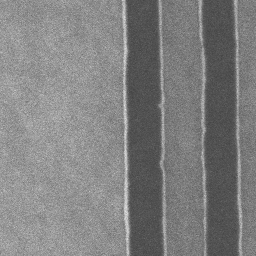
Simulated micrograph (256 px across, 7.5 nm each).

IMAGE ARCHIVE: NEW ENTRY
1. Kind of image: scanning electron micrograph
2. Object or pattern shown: one or a few lines or trenches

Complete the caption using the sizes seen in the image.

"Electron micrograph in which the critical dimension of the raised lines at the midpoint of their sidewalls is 276 nm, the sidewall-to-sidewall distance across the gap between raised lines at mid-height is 293 nanometers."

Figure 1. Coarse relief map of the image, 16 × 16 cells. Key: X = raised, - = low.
--------XX--XXX-
--------XX--XXX-
--------XX---XX-
--------XX---XX-
--------XX---XX-
--------XX---XX-
--------XX---XX-
--------XX---XX-
--------XX---XX-
--------XX---XX-
--------XX---XX-
--------XX---XX-
--------XX---XX-
--------XX---XX-
--------XX---XX-
--------XX---XX-